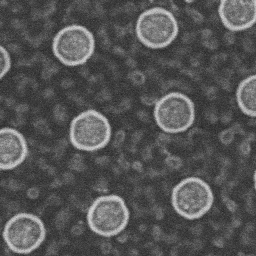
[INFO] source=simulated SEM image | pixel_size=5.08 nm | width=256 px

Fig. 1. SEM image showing raised bodies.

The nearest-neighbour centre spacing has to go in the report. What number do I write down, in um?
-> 0.435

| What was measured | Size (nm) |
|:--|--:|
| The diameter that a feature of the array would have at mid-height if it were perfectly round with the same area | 187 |